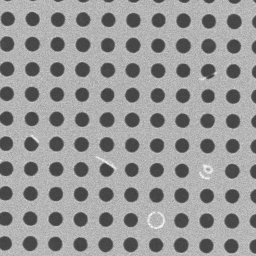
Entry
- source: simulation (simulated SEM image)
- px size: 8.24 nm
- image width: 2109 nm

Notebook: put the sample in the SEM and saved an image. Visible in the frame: a regular array of holes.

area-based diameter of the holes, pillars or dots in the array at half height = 122 nm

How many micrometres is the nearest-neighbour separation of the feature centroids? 0.205